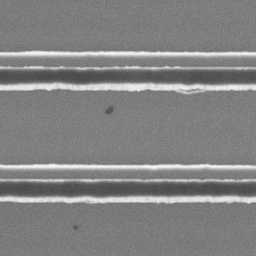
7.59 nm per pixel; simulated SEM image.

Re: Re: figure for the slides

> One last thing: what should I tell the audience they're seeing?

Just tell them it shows lines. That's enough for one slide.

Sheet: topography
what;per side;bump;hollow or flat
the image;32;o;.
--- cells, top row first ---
................................
................................
................................
................................
................................
................................
................................
................................
oo.ooo.o......oooo..ooo.........
oooooooooooooooooooooooooooooooo
oooooooooooooooooooooooooooooooo
.......................oo.......
................................
................................
................................
................................
................................
................................
................................
................................
................................
................................
................................
oooooooooooooooooooooooooooooooo
oooooooooooooooooooooooooooooooo
................................
................................
................................
................................
................................
................................
................................